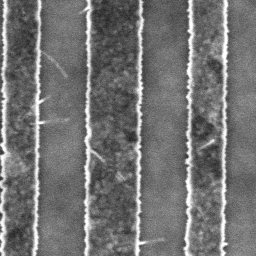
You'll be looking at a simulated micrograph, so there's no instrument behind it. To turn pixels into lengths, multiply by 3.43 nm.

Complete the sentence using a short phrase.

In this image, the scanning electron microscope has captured lines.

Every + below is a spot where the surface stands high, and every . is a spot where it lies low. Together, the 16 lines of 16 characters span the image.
++...++++...++..
++...++++...++..
++...++++...++..
++....+++...++..
++....+++...++..
++...++++...++..
++...++++...++..
++...++++...++..
++...++++...++..
++...++++...++..
++...++++...++..
++...++++...++..
++...++++...++..
++...++++...++..
++...++++...++..
++...++++...++..